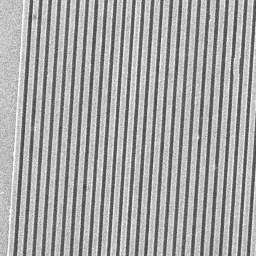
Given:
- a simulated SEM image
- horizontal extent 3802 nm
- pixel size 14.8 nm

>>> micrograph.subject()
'parallel lines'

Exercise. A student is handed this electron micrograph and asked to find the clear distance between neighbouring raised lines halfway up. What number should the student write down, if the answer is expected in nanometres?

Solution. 55.6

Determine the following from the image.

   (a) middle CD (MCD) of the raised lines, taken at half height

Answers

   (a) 81.5 nm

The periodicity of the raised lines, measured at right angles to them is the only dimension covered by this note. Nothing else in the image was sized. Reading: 138 nm